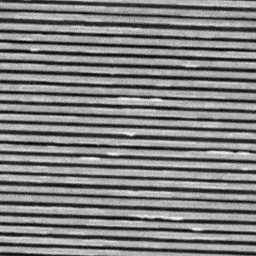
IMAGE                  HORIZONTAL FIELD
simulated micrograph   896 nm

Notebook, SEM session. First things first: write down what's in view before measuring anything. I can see parallel lines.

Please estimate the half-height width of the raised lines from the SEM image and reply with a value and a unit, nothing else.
0.021 um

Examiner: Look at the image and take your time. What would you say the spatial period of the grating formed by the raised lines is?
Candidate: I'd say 0.0355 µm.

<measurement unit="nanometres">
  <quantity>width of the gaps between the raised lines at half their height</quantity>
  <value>14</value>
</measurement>